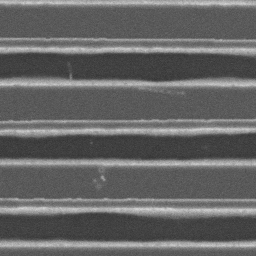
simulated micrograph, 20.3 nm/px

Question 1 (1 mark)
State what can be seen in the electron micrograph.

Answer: lines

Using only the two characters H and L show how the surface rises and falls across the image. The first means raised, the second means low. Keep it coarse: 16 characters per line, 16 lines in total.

HHHHHHHHHHHHHHHH
HHHHHHHHHHHHHHHH
HHHHHHHHHHHHHHHH
LLLLLLLLLLLLLLLL
LLLLLLLLLLLLLLLL
HHHHHHHHHHHHHHHH
HHHHHHHHHHHHHHHH
HHHHHHHHHHHHHHHH
LLLLLLLLLLLLLLLL
LLLLLLLLLLLLLLLL
HHHHHHHHHHHHHHHH
HHHHHHHHHHHHHHHH
HHHHHHHHHHHHHHHH
LLLLLLLLLLLLLLLL
LLLLLLLLLLLLLLLL
HHHHHHHHHHHHHHHH